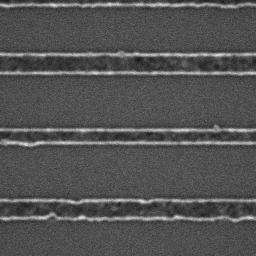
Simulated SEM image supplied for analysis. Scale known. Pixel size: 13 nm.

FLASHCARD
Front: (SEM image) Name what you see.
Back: one or a few lines or trenches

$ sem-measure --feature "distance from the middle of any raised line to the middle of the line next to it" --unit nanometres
947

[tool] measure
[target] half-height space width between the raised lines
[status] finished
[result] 738 nanometers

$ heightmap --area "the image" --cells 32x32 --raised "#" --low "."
################################
................................
................................
................................
................................
................................
................................
################################
################################
................................
................................
................................
................................
................................
................................
................................
################################
################################
................................
................................
................................
................................
................................
................................
................................
################################
################################
................................
................................
................................
................................
................................